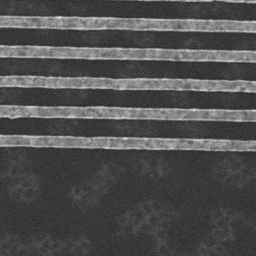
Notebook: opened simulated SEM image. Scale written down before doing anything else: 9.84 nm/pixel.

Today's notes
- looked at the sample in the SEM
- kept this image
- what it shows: parallel lines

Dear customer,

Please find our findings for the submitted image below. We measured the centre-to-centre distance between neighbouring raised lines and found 0.293 um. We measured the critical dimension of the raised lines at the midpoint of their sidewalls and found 99.6 nm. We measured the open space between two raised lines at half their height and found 198 nm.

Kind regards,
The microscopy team